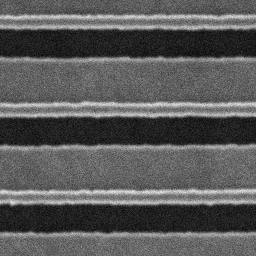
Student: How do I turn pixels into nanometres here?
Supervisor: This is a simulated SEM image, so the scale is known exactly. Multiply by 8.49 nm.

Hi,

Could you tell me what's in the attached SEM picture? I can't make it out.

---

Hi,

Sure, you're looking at lines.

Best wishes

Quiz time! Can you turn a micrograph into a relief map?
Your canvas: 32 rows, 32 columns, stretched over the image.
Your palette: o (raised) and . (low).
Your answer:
oooooooooooooooooooooooooooooooo
oooooooooooooooooooooooooooooooo
oooooooooooooooooooooooooooooooo
.ooooooooooooooooooooooooooooooo
................................
................................
................................
oooooooooooooooooooooooooooooooo
oooooooooooooooooooooooooooooooo
oooooooooooooooooooooooooooooooo
oooooooooooooooooooooooooooooooo
oooooooooooooooooooooooooooooooo
oooooooooooooooooooooooooooooooo
oooooooooooooooooooooooooooooooo
...oo.o.....o.....oo............
................................
................................
................................
oooooooooooooooooooooooooooooooo
oooooooooooooooooooooooooooooooo
oooooooooooooooooooooooooooooooo
oooooooooooooooooooooooooooooooo
oooooooooooooooooooooooooooooooo
oooooooooooooooooooooooooooooooo
oooooooooooooooooooooooooooooooo
.o..............................
................................
................................
................................
oooooooooooooooooooooooooooooooo
oooooooooooooooooooooooooooooooo
oooooooooooooooooooooooooooooooo